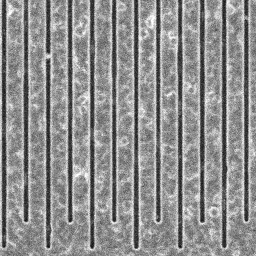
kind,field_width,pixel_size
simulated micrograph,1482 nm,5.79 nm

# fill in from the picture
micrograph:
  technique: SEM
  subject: parallel lines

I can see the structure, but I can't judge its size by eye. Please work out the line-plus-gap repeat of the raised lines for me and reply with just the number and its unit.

128 nanometres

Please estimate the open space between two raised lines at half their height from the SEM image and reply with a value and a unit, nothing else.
28.2 nm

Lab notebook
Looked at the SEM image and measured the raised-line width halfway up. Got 0.101 um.